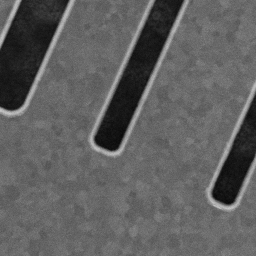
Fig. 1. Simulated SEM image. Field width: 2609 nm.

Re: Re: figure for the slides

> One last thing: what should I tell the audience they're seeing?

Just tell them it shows one or a few lines or trenches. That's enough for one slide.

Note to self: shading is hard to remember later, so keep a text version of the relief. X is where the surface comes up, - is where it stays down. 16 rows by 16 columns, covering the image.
X---XXXXX--XXXXX
X---XXXXX--XXXXX
---XXXXX---XXXXX
---XXXXX--XXXXXX
---XXXXX--XXXXXX
--XXXXX--XXXXXXX
--XXXXX--XXXXXXX
XXXXXX--XXXXXXX-
XXXXXX--XXXXXXX-
XXXXXXXXXXXXXX--
XXXXXXXXXXXXXX--
XXXXXXXXXXXXX--X
XXXXXXXXXXXXX--X
XXXXXXXXXXXXXXXX
XXXXXXXXXXXXXXXX
XXXXXXXXXXXXXXXX